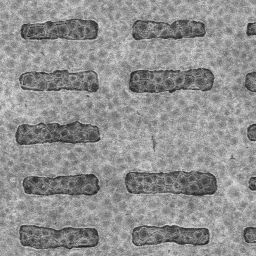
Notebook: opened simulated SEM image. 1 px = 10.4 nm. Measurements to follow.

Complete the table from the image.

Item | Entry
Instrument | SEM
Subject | a regular array of holes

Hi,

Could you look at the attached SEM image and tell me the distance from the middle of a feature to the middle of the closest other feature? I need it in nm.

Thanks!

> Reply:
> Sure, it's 539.